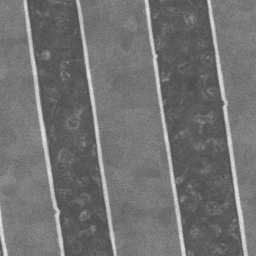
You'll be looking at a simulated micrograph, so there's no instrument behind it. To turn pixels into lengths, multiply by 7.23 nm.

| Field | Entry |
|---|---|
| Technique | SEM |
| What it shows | one or a few lines or trenches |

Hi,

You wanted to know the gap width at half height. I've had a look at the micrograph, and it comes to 412 nanometers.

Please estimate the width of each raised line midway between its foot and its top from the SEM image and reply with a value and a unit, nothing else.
493 nanometers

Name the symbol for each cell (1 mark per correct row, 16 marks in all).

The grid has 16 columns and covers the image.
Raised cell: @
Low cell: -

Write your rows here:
@@---@@@@----@@@
@@---@@@@----@@@
@@---@@@@----@@@
@@---@@@@@----@@
@@----@@@@----@@
@@----@@@@----@@
@@----@@@@----@@
@@@---@@@@----@@
@@@---@@@@----@@
@@@---@@@@@---@@
@@@---@@@@@----@
@@@---@@@@@----@
@@@----@@@@----@
@@@@---@@@@----@
@@@@---@@@@----@
@@@@---@@@@----@